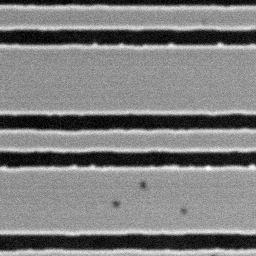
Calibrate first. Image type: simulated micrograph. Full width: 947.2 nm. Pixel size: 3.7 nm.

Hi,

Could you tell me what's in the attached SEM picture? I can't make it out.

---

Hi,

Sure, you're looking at lines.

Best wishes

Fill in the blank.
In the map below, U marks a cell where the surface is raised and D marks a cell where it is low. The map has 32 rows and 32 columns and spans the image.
DDDDDDDDDDDDDDDDDDDDDDDDDDDDDDDD
UUUUUUUUUUUUUUUUUUUUUUUUUUUUUUUU
UUUUUUUUUUUUUUUUUUUUUUUUUUUUUUUU
UUUUUUUUUUUUUUUUUUUUUUUUUUUUUUUU
DDDDDDDDDDDDDDDDDDDDDDDDDDDDDDDD
DDDDDDDDDDDDDDDDDDDDDDDDDDDDDDDD
UUUUUUUUUUUUUUUUUUUUUUUUUUUUUUUU
UUUUUUUUUUUUUUUUUUUUUUUUUUUUUUUU
UUUUUUUUUUUUUUUUUUUUUUUUUUUUUUUU
UUUUUUUUUUUUUUUUUUUUUUUUUUUUUUUU
UUUUUUUUUUUUUUUUUUUUUUUUUUUUUUUU
UUUUUUUUUUUUUUUUUUUUUUUUUUUUUUUU
UUUUUUUUUUUUUUUUUUUUUUUUUUUUUUUU
UUUUUUUUUUUUUUUUUUUUUUUUUUUUUUUU
DDDDDDDDDDDDDDDDDDDDDDDDDDDDDDDD
DDDDDDDDDDDDDDDDDDDDDDDDDDDDDDDD
UUUUUUUUUUUUUUUUUUUUUUUUUUUUUUUU
UUUUUUUUUUUUUUUUUUUUUUUUUUUUUUUU
UUUUUUUUUUUUUUUUUUUUUUUUUUUUUUUU
DDDDDDDDDDDDDDDDDDDDDDDDDDDDDDDD
DDDDDDDDDDDDDDDDDDDDDDDDDDDDDDDD
UUUUUUUUUUUUUUUUUUUUUUUUUUUUUUUU
UUUUUUUUUUUUUUUUUUUUUUUUUUUUUUUU
UUUUUUUUUUUUUUUUUUUUUUUUUUUUUUUU
UUUUUUUUUUUUUUUUUUUUUUUUUUUUUUUU
UUUUUUUUUUUUUUUUUUUUUUUUUUUUUUUU
UUUUUUUUUUUUUUUUUUUUUUUUUUUUUUUU
UUUUUUUUUUUUUUUUUUUUUUUUUUUUUUUU
UUUUUUUUUUUUUUUUUUUUUUUUUUUUUUUU
DDDDDDDDDDDDDDDDDDDDDDDDDDDDDDDD
DDDDDDDDDDDDDDDDDDDDDDDDDDDDDDDD
UUUUUUUUUUUUUUUUUUUUUUUUUUUUUUUU